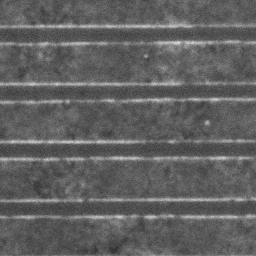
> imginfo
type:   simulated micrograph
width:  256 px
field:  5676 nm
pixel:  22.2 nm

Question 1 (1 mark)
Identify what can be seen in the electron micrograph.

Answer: lines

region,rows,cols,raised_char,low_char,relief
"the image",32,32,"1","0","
11111111111111111111111111111111
11111111111111111111111111111111
11111111111111111111111111111111
00000000000000000000000000000000
00000000000000000000000000000000
11000100111111111111111111111111
11111111111111111111111111111111
11111111111111111111111111111111
11111111111111111111111111111111
11111111111111111111111111111111
11111111111010000011000000000000
00000000000000000000000000000000
00000000000000000000000011111111
11111111111111111111111111111111
11111111111111111111111111111111
11111111111111111111111111111111
11111111111111111111111111111111
11111111111111111111111111111111
00000000000000000000000000000000
00000000000000000000000000000000
11111111111111111111111111111111
11111111111111111111111111111111
11111111111111111111111111111111
11111111111111111111111111111111
11111111111111111111111111111111
00000000000000000000000000000000
00000000000000000000000000000000
11111111111111111111111111111111
11111111111111111111111111111111
11111111111111111111111111111111
11111111111111111111111111111111
11111111111111111111111111111111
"